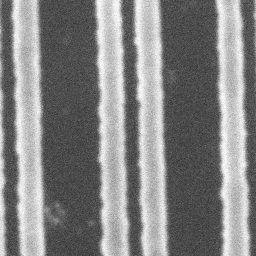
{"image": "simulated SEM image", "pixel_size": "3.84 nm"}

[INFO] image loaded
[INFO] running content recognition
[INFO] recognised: lines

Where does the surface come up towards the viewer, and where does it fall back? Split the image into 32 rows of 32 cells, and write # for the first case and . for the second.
..###.......###..###.......###..
..###.......###..###.......###..
..###.......###..###.......###..
..###.......###..###.......###..
..###.......###..###.......###..
..###.......###..###.......###..
..###.......###..###.......###..
..###.......###..###........##..
..###.......###..###........##..
..###........##..###........##..
..###........##..###.......###..
..###........##..###........##..
..###........##..###........##..
..###.......###...##........##..
..###........##..###........##..
..###........##...##........##..
..###........###..##........###.
..###........###..##........###.
..###........###..##........###.
..###........###..##........###.
..###........###.####.......###.
..###........###..###.......###.
..###........###..###.......###.
..###........###..###.......###.
..###........###..###.......###.
..###........###..###.......###.
..###........###..###.......###.
..###........###..###.......###.
..###........###..###.......###.
..###........###..###.......###.
...##........###..###.......###.
#..##........###..###.......###.